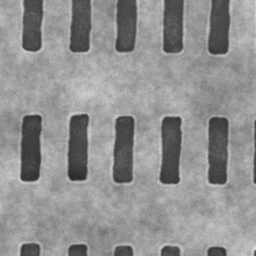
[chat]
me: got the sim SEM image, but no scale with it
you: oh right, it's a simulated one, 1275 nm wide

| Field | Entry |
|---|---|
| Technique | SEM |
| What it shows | holes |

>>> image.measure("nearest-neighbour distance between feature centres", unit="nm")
235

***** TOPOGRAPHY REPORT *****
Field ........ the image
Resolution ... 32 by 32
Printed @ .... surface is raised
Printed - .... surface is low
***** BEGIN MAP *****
@@@--@@@@---@@---@@@---@@@---@@@
@@@--@@@@---@@---@@@---@@@---@@@
@@@--@@@@---@@---@@@---@@@---@@@
@@@--@@@@--@@@---@@@---@@@---@@@
@@@--@@@@--@@@@--@@@---@@@---@@@
@@@--@@@@--@@@---@@@---@@@---@@@
@@@@@@@@@--@@@@-@@@@@--@@@--@@@@
@@@@@@@@@@@@@@@@@@@@@@@@@@@@@@@@
@@@@@@@@@@@@@@@@@@@@@@@@@@@@@@@@
@@@@@@@@@@@@@@@@@@@@@@@@@@@@@@@@
@@@@@@@@@@@@@@@@@@@@@@@@@@@@@@@@
@@@@@@@@@@@@@@@@@@@@@@@@@@@@@@@@
@@@@@@@@@@@@@@@@@@@@@@@@@@@@@@@@
@@@@@@@@@@@@@@@@@@@@@@@@@@@@@@@@
@@@--@@@@--@@@@-@@@@@-@@@@@-@@@@
@@@--@@@@--@@@---@@@---@@@---@@@
@@@--@@@@--@@@---@@@---@@@---@@@
@@---@@@---@@@---@@@---@@@---@@@
@@---@@@---@@@---@@@---@@@---@@@
@@---@@@---@@@---@@@---@@@---@@@
@@@--@@@---@@@---@@@---@@@---@@@
@@@--@@@---@@@---@@@---@@@---@@@
@@@--@@@@--@@@---@@@---@@@--@@@@
@@@@@@@@@@@@@@@@@@@@@@@@@@@@@@@@
@@@@@@@@@@@@@@@@@@@@@@@@@@@@@@@@
@@@@@@@@@@@@@@@@@@@@@@@@@@@@@@@@
@@@@@@@@@@@@@@@@@@@@@@@@@@@@@@@@
@@@@@@@@@@@@@@@@@@@@@@@@@@@@@@@@
@@@@@@@@@@@@@@@@@@@@@@@@@@@@@@@@
@@@@@@@@@@@@@@@@@@@@@@@@@@@@@@@@
@@@--@@@@@@@@@@-@@@@@@@@@@@@@@@@
@@---@@@---@@@---@@@---@@@--@@@@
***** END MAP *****